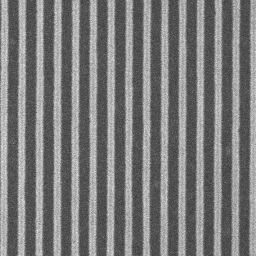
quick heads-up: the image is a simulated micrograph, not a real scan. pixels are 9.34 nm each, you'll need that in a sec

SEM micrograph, parallel lines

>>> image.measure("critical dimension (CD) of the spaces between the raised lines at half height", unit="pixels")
12.3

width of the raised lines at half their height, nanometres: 52.6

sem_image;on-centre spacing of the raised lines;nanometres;166